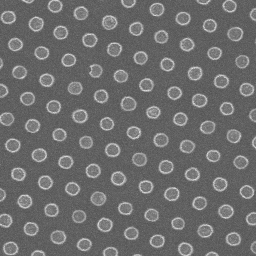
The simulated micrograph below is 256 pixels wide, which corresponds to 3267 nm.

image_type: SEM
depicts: a regular array of raised bodies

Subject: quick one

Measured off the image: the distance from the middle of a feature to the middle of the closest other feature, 0.344 um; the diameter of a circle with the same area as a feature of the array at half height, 174 nm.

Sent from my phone